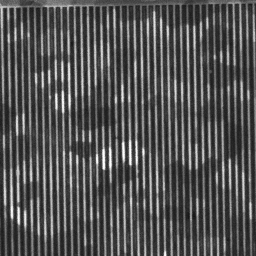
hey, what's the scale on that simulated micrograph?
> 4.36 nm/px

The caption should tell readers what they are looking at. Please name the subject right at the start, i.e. parallel lines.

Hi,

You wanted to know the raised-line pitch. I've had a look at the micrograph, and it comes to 28.9 nanometres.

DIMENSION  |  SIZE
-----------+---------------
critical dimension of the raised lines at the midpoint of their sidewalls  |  7.1 nm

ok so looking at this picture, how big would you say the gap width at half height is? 20.7 nanometers